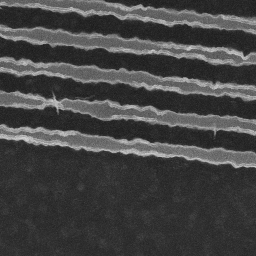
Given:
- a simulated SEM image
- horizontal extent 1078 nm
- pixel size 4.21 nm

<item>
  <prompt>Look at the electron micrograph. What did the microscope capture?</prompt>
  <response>parallel lines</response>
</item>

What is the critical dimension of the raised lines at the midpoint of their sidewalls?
14.2 pixels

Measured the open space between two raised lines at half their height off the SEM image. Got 82.2 nm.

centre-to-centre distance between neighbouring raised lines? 140 nm